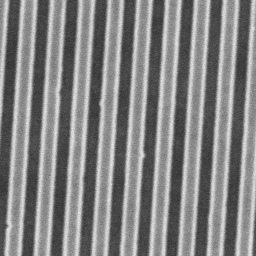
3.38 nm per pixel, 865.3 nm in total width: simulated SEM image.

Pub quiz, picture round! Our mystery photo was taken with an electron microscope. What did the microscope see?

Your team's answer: parallel lines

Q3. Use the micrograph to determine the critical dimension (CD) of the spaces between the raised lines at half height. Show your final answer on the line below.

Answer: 52.3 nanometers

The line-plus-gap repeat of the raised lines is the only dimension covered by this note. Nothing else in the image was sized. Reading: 97.2 nm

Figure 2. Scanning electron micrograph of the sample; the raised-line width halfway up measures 13.5 px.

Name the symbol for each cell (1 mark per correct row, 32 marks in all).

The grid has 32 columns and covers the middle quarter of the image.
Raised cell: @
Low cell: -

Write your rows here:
---@@@----@@@-----@@@----@@@----
---@@@----@@@----@@@@----@@@----
---@@@----@@@----@@@@----@@@----
---@@@----@@@----@@@-----@@@----
---@@@----@@@----@@@-----@@@----
---@@@----@@@----@@@----@@@@---@
---@@@----@@@----@@@----@@@@---@
---@@@----@@@----@@@----@@@@----
---@@@----@@@----@@@----@@@-----
---@@@---@@@@----@@@----@@@----@
---@@@---@@@@----@@@----@@@----@
--@@@-----@@@----@@@----@@@----@
--@@@----@@@@----@@@----@@@----@
--@@@----@@@@----@@@----@@@----@
--@@@----@@@@----@@@----@@@----@
--@@@----@@@-----@@@----@@@----@
--@@@----@@@----@@@@----@@@----@
--@@@----@@@----@@@@----@@@----@
--@@@----@@@----@@@@----@@@----@
--@@@----@@@----@@@-----@@@----@
--@@@----@@@----@@@----@@@-----@
--@@@----@@@----@@@----@@@@---@@
--@@@----@@@----@@@@---@@@@----@
--@@@----@@@----@@@----@@@-----@
--@@@----@@@----@@@----@@@----@@
--@@@----@@@----@@@----@@@----@@
--@@@----@@@----@@@----@@@----@@
-@@@-----@@@----@@@----@@@----@@
-@@@----@@@@----@@@----@@@----@@
-@@@----@@@@----@@@----@@@----@@
-@@@----@@@@----@@@----@@@----@@
-@@@----@@@-----@@@----@@@----@@